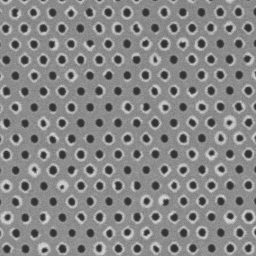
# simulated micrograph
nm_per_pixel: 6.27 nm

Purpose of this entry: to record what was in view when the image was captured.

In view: a regular array of holes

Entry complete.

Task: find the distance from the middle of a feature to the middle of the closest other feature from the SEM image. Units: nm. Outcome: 113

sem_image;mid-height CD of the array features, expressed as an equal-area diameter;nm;48